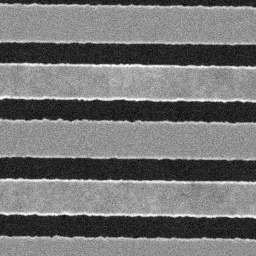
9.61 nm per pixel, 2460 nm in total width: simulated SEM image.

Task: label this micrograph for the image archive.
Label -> lines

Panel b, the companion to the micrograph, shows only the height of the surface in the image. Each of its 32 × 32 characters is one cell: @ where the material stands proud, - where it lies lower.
@@@-@---------------------------
@@@@@@@@@@@@@@@@@@@@@@@@@@@@@@@@
@@@@@@@@@@@@@@@@@@@@@@@@@@@@@@@@
@@@@@@@@@@@@@@@@@@@@@@@@@@@@@@@@
@@@@@@@@@@@@@@@@@@@@@@@@@@@@@@@@
--------------------------------
--------------------------------
--------------------------------
@@@@@@@@@@@@@@@@@@@@@@@@@@@@@@@@
@@@@@@@@@@@@@@@@@@@@@@@@@@@@@@@@
@@@@@@@@@@@@@@@@@@@@@@@@@@@@@@@@
@@@@@@@@@@@@@@@@@@@@@@@@@@@@@@@@
----------@@@@-@@@@@@@@@@@@@@@@@
--------------------------------
--------------------------------
@@@@@@@@@@@@@@@@@@@@@@@@@@@@@@@@
@@@@@@@@@@@@@@@@@@@@@@@@@@@@@@@@
@@@@@@@@@@@@@@@@@@@@@@@@@@@@@@@@
@@@@@@@@@@@@@@@@@@@@@@@@@@@@@@@@
@@@@@@@@@@@@@@@@@@@@@@@@@@@@@@@@
--------------------------------
--------------------------------
@@@--@-@------------------------
@@@@@@@@@@@@@@@@@@@@@@@@@@@@@@@@
@@@@@@@@@@@@@@@@@@@@@@@@@@@@@@@@
@@@@@@@@@@@@@@@@@@@@@@@@@@@@@@@@
@@@@@@@@@@@@@@@@@@@@@@@@@@@@@@@@
--------------------------------
--------------------------------
--------------------------------
@@@@@@@@@@@@@@@@@@@@@@@@@@@@@@@@
@@@@@@@@@@@@@@@@@@@@@@@@@@@@@@@@